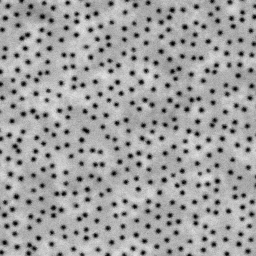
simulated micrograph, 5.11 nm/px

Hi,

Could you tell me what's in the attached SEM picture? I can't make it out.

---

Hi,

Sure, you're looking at a regular array of holes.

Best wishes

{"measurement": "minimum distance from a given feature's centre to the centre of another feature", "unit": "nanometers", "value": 52.7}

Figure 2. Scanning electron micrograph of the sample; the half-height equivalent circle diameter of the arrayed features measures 23 nm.